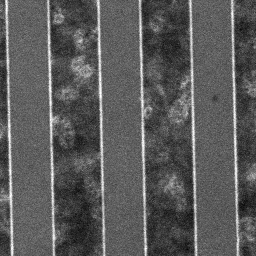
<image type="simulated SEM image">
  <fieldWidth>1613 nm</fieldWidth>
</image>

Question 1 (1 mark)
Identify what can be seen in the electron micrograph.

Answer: one or a few lines or trenches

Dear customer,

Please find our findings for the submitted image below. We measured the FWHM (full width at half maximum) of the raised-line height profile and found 320 nm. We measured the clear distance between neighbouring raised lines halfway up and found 0.258 µm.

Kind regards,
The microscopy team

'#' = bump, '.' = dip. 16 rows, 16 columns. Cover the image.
...###...###...#
...###...###...#
...###...###...#
...###...###...#
#..###...###...#
#..###...###...#
#..###...###...#
#..###...###...#
#..###...###...#
#..###...###...#
#..###...###...#
#..###...###...#
#..###...###...#
#..###...###...#
#..###...###...#
#..###...###...#